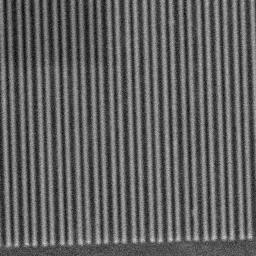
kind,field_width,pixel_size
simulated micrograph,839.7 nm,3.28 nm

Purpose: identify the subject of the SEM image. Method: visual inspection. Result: parallel lines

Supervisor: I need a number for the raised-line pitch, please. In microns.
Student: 0.0293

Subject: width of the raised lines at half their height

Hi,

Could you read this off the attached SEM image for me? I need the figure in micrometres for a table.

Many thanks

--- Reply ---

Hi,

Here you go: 0.0127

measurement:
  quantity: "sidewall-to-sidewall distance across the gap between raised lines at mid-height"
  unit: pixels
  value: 3.87